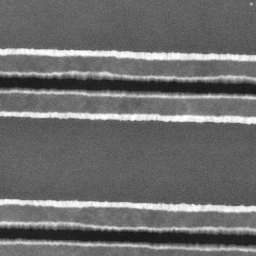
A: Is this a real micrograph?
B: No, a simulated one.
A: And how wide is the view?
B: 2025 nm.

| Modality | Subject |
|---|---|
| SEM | lines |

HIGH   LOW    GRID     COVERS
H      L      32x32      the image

LLLLLLLLLLLLLLLLLLLLLLLLLLLLLLLL
LLLLLLLLLLLLLLLLLLLLLLLLLLLLLLLL
LLLLLLLLLLLLLLLLLLLLLLLLLLLLLLLL
LLLLLLLLLLLLLLLLLLLLLLLLLLLLLLLL
LLLLLLLLLLLLLLLLLLLLLLLLLLLLLLLL
LLLLLLLLLLLLLLLLLLLLLLLLLLLLLLLL
HHHHHLLLLLLLLLLLLLLLLLLLLLLLLLLL
HHHHHHHHHHHHHHHHHHHHHHHHHHHHHHHH
HHHHHHHHHHHHHHHHHHHHHHHHHHHHHHHH
LLLHLHHHHHHHHHHHHHHHHHHHHHHHHHHH
LLLLLLLLLLLLLLLLLLLLLLLLLLLLLLLL
HHHHHHHHHHHLLHLLLLLLLLLLLLLLLLLL
HHHHHHHHHHHHHHHHHHHHHHHHHHHHHHHH
HHHHHHHHHHHHHHHHHHHHHHHHHHHHHHHH
LLLLLHLHHHHHHHHHHHHHHHHHHHHHHHHH
LLLLLLLLLLLLLLLLLLLLLLLLLLLLLLLL
LLLLLLLLLLLLLLLLLLLLLLLLLLLLLLLL
LLLLLLLLLLLLLLLLLLLLLLLLLLLLLLLL
LLLLLLLLLLLLLLLLLLLLLLLLLLLLLLLL
LLLLLLLLLLLLLLLLLLLLLLLLLLLLLLLL
LLLLLLLLLLLLLLLLLLLLLLLLLLLLLLLL
LLLLLLLLLLLLLLLLLLLLLLLLLLLLLLLL
LLLLLLLLLLLLLLLLLLLLLLLLLLLLLLLL
LLLLLLLLLLLLLLLLLLLLLLLLLLLLLLLL
LLLLLLLLLLLLLLLLLLLLLLLLLLLLLLLL
HHHHHHHHHHHHHHHHLLLLLLLLLLLLLLLL
HHHHHHHHHHHHHHHHHHHHHHHHHHHHHHHH
HHHHHHHHHHHHHHHHHHHHHHHHHHHHHHHH
LLLLLLLLLLHHHHHHHHHHHHHHHHHHHHHH
LLLLLLLLLLLLLLLLLLLLLLLLLLLLLLLL
HHHHHHHHHHHHHHHHHHLLLLLLLLLLLLLL
HHHHHHHHHHHHHHHHHHHHHHHHHHHHHHHH